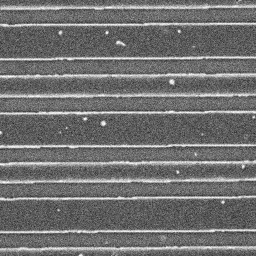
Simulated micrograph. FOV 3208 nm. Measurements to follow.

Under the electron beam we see lines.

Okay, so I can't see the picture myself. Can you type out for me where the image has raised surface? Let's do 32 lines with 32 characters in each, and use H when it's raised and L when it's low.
HHHHHHHHHHHHHHHHHHHHHHHHHHHHHHHH
LLLLLLLLLLLLLLLLLLLLLLLLLLLLLLLL
LLLLLLLLLLLLLLLLLLLLLLLLLLLLLLLL
HHHHHHHHHHHHHHHHHHHHHHHHHHHHHHHH
HHHHHHHHHHHHHHHHHHHHHHHHHHHHHHHH
HHHHHHHHHHHHHHHHHHHHHHHHHHHHHHHH
HHHHHHHHHHHHHHHHHHHHHHHHHHHHHHHH
LLLLLLLLLLLLLLLLLLLLLLLLLLLLLLLL
LLLLLLLLLLLLLLLLLLLLLLLLLLLLLLLL
LLLLLLLLLLLLLHHLLLLHHHHHHHHHHHHH
HHHHHHHHHHHHHHHHHHHHHHHHHHHHHHHH
HHHHHHHHHHHHHHHHHHHHHHHHHHHHHHHH
LLLLLLLLLLLLLLLLLLLLLLLLLLLLLLLL
LLLLLLLLLLLLLLLLLLLLLLLLLLLLLLLL
HHHHHHHHHHHHHHHHHHHHHHHHHHHHHHHH
HHHHHHHHHHHHHHHHHHHHHHHHHHHHHHHH
HHHHHHHHHHHHHHHHHHHHHHHHHHHHHHHH
HHHHHHHHHHHHHHHHHHHHHHHHHHHHHHHH
LLLLLLLLLLLLLLLLLLLLLLLLLLLLLLLL
LLLLLLLLLLLLLLLLLLLLLLLLLLLLLLLL
LHHHHHHHHHHHHHHHHHHHHHHHHHHHHHHH
HHHHHHHHHHHHHHHHHHHHHHHHHHHHHHHH
HHHHHHHHHHHHHHHHHHHHHHHHLLLLLLLL
LLLLLLLLLLLLLLLLLLLLLLLLLLLLLLLL
LLLLLLLLLLLLLLLLLLLLLLLLLLLLLLLL
HHHHHHHHHHHHHHHHHHHHHHHHHHHHHHHH
HHHHHHHHHHHHHHHHHHHHHHHHHHHHHHHH
HHHHHHHHHHHHHHHHHHHHHHHHHHHHHHHH
HHHHHHHHHHHHHHHHHHHHHHHHHHHHHHHH
LLLLLLLLLLLLLLLLLLLLLLLLLLLLLLLL
LLLLLLLLLLLLLLLLLLLLLLLLLLLLLLLL
HHHHHHHHHHHHHHHHHHHHHHHHHHHHHHHH